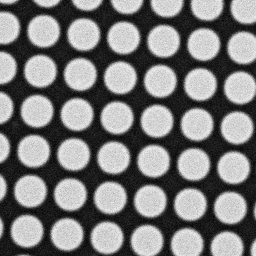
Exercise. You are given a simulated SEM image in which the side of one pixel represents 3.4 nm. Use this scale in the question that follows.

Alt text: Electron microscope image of an array of small figures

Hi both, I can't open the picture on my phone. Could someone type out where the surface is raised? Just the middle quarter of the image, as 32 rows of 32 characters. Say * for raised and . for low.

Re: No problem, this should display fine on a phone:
.******....******.......*.......
********...*******...******.....
********..********...*******...*
********..********..********..**
.*******..********..********..**
.******....******...********..**
....*.......*****....******...**
......................****.....*
................................
.*****..........................
*******....*****......**........
*******...*******....*****......
*******..********...*******...**
*******..********..********...**
*******...*******..********...**
.*****....*******...*******..***
..**.......*****....******....**
.....................****.....**
...............................*
*****...........................
******....*****......**.........
******...*******....*****......*
******...*******...*******....**
******...*******...*******...***
******...*******...*******...***
*****....*******...*******...***
..........*****....*******...***
....................*****....***
..............................**
****............................
*****....*****......*...........
*****...*******....*****......**